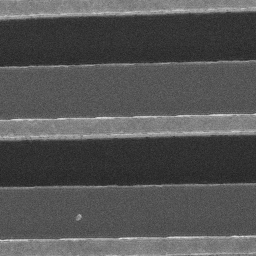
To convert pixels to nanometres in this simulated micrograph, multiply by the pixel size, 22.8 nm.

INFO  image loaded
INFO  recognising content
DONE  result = lines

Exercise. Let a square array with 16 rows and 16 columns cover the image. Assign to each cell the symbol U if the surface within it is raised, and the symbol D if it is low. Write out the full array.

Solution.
UUUUUUUUUUUUUUUU
DDDDDDDDDDDDDDDD
DDDDDDDDDDDDDDDD
DDDDDDDDDDDDDDDD
UUUUUUUUUUUUUUUU
UUUUUUUUUUUUUUUU
UUUUUUUUUUUUUUUU
UUUUUUUUUUUUUUUU
UUUDDDDDDDDDDDDD
DDDDDDDDDDDDDDDD
DDDDDDDDDDDDDDDD
DDDDDDDDDDDDDDDD
UUUUUUUUUUUUUUUU
UUUUUUUUUUUUUUUU
UUUUUUUUUUUUUUUU
UUUUUUUUUUUUUUUU